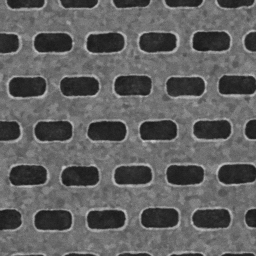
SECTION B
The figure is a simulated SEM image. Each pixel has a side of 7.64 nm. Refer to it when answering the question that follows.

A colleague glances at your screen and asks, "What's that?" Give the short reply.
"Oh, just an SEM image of a regular array of holes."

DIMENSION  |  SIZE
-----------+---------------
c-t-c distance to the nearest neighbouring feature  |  388 nm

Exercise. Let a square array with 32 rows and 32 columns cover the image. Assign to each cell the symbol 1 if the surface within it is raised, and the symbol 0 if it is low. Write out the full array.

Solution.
10000011000011000001100001100000
11111111111111111111111111111111
11111111111111111111111111111111
11111111111111111111111111111111
00110000011000001000001100000110
00010000011000001000001100000110
00111000111000011100011111101111
11111111111111111111111111111111
11111111111111111111111111111111
11000111100111100011110001110001
10000011000011000001100000100000
10000011000011000001100000100000
11111111111111111111111111111111
11111111111111111111111111111111
11111111111111111111111111111111
00111000011000001100001100000110
00010000011000001000001100000110
00111000011000011100001110001111
11111111111111111111111111111111
11111111111111111111111111111111
11111111111111111111111011110001
10000011000011000001100000100000
10000011000011000001100000100000
11111111111111111111111111111111
11111111111111111111111111111111
11111111111111111111111111111111
00111000011000011100001100000110
00010000011000001100001100000110
00110000011000011100001100001111
11111111111111111111111111111111
11111111111111111111111111111111
11111111111111111111111111111011